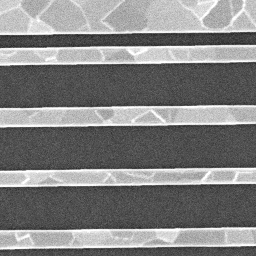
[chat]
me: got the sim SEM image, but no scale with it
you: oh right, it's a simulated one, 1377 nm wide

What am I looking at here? wiring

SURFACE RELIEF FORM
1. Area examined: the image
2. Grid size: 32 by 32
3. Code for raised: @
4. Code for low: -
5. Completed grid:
@@@@@@@@@@@@@@@@@@@@@@@@@@@@@@@@
@@@@@@@@@@@@@@@@@@@@@@@@@@@@@@@@
@@@@@@@@@@@@@@@@@@@@@@@@@@@@@@@@
@@@@@@@@@@@@@@@@@@@@@@@@@@@@@@@@
--------------------------------
--------------------------------
@@@@@@@@@@@@@@@@@@@@@@@@@@@@@@@@
@@@@@@@@@@@@@@@@@@@@@@@@@@@@@@@@
--------------------------------
--------------------------------
--------------------------------
--------------------------------
--------------------------------
-------------@@@@@@@@@@@@@@@@@@@
@@@@@@@@@@@@@@@@@@@@@@@@@@@@@@@@
@@@@@@@@@@@@@@@@@@@@@-----------
--------------------------------
--------------------------------
--------------------------------
--------------------------------
--------------------------------
@@@@@@@@@@@@@@@@@@@@@@@@@@@@@@@@
@@@@@@@@@@@@@@@@@@@@@@@@@@@@@@@@
--------------------------------
--------------------------------
--------------------------------
--------------------------------
--------------------------------
--------------------------------
@@@@@@@@@@@@@@@@@@@@@@@@@@@@@@@@
@@@@@@@@@@@@@@@@@@@@@@@@@@@@@@@@
--------------------------------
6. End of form